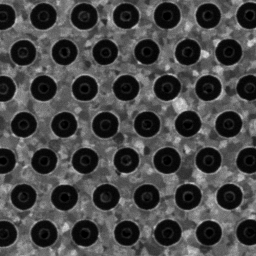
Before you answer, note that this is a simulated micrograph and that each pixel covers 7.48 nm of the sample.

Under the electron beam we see a regular array of ring-shaped grooves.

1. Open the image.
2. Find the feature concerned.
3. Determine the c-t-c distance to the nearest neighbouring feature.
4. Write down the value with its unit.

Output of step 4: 305 nm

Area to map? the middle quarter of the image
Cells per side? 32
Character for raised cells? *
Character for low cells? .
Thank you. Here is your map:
******************************.*
********************************
***************.*********..*****
***....******.....*****.....****
**......****.......****......***
**..**...***..***..***...**...**
**..**...***..***..***...**..***
**......****.......****......***
***.....*****.....*****.....****
********************************
********************************
********************************
..******....*******....******...
...****......*****......****....
*..****..**...***...**..****..**
*..****..**...***...**..****..**
...****.......***.......****....
...*****.....******....******...
.********...********..**********
********************************
********************************
***....*******....******....****
**......*****......****......***
**..**...***...**..***...**..***
**..**...***..***..***...**..***
**......*****......***.......***
***.....*****.....*****......***
****..*********.*********..*****
********************************
********************************
..*******....******....******...
...*****......****......****....